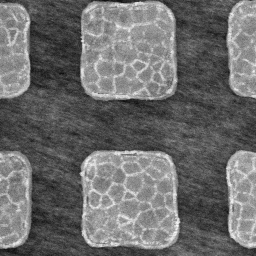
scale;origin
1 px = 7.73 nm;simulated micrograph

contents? raised bodies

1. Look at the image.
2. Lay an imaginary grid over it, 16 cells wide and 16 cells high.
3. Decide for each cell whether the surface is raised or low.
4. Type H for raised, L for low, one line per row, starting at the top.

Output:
HLLLLHHHHHLLLLLH
HHLLLHHHHHHLLLHH
HHLLLHHHHHHLLLHH
HHLLLHHHHHHLLLHH
HHLLLHHHHHHLLLHH
HHLLLHHHHHHLLLLH
LLLLLLLLLLLLLLLL
LLLLLLLLLLLLLLLL
LLLLLLLLLLLLLLLL
LLLLLLHHHLLLLLLH
HHLLLHHHHHHLLLHH
HHLLLHHHHHHLLLHH
HHLLLHHHHHHLLLHH
HHLLLHHHHHHLLLHH
HHLLLHHHHHHLLLHH
LLLLLLLLLHLLLLLL